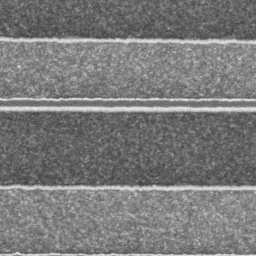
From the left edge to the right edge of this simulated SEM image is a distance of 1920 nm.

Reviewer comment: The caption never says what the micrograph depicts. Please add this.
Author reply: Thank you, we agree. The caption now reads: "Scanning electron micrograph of lines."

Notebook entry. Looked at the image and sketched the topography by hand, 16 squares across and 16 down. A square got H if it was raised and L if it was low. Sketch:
LLLLLLLLLLLLLLLL
LLLLLLLLLLLLLLLL
HLLLLLLLLLLLLLLL
HHHHHHHHHHHHHHHH
HHHHHHHHHHHHHHHH
HHHHHHHHHHHHHHHH
HHHHHHHHHHHHHHHH
LLLLLLLLLLLLLLLL
LLLLLLLLLLLLLLLL
LLLLLLLLLLLLLLLL
LLLLLLLLLLLLLLLL
LLLLLLLLLLLLLLLL
HHHHHHHHHHHHHHHH
HHHHHHHHHHHHHHHH
HHHHHHHHHHHHHHHH
HHHHHHHHHHHHHHHH